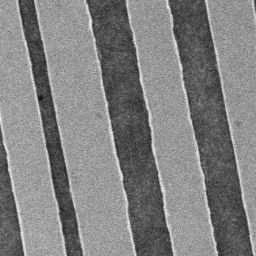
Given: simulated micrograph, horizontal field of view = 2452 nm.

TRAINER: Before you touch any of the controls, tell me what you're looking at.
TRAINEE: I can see one or a few lines or trenches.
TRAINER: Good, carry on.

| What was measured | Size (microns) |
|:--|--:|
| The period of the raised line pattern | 0.753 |